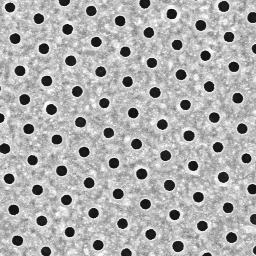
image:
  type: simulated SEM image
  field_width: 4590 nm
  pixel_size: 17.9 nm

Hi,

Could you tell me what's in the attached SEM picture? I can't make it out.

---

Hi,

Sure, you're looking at a regular array of holes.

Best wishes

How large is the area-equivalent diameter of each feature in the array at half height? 197 nm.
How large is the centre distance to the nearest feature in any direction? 0.534 microns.